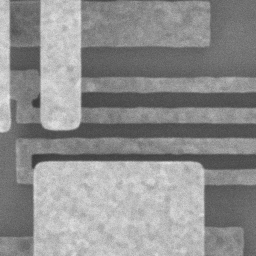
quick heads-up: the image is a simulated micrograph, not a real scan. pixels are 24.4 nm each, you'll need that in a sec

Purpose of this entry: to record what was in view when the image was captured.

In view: wiring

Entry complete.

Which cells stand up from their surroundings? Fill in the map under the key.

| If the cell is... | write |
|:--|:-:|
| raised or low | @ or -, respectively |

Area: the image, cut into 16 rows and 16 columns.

@--@@-----------
@--@@-----------
@--@@-----------
@--@@-----------
@--@@-----------
@--@@-----------
@--@@-----------
@--@@-----------
----------------
----------------
--@@@@@@@@@@@---
--@@@@@@@@@@@---
--@@@@@@@@@@@---
--@@@@@@@@@@@---
--@@@@@@@@@@@---
--@@@@@@@@@@@---